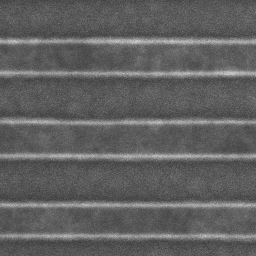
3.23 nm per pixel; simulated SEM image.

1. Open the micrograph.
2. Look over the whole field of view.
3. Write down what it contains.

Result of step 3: one or a few lines or trenches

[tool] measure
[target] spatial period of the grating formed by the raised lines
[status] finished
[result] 264 nm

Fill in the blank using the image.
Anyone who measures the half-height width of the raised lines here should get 103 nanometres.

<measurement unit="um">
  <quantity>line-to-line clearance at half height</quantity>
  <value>0.157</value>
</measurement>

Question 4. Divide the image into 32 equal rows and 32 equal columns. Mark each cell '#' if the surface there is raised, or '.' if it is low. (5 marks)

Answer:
................................
................................
................................
................................
................................
################################
################################
################################
################################
................................
................................
................................
................................
................................
................................
################################
################################
################################
################################
.........................#######
................................
................................
................................
................................
................................
................................
################################
################################
################################
.................###........####
................................
................................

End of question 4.